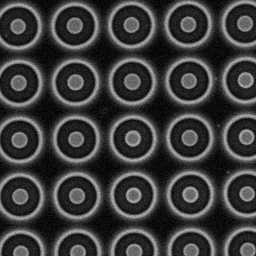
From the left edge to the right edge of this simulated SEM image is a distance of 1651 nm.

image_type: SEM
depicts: an array of small figures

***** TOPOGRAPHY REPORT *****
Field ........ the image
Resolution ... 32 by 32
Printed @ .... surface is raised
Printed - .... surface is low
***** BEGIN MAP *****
@@@@@@@@@@@@@@@@-@@@@@@-@@@@@@--
----@@@----@@@----@@@-----@@----
-----@@-----@@-----@@-----@@----
-----@@-----@@-----@@-----@@----
-----@@-----@@-----@@-----@@@---
@---@@@@---@@@@---@@@@@-@@@@@@-@
@@@@@@@@@@@@@@@@@@@@@@@@@@@@@@@@
@@@@@@@@@@@@@@@@@@@@@@@@@@@@@@-@
@---@@@@---@@@@----@@@----@@@---
-----@@-----@@-----@@-----@@----
-----@@-----@@-----@@-----@@----
-----@@-----@@-----@@-----@@@---
@---@@@@---@@@@---@@@@@--@@@@@-@
@@@@@@@@@@@@@@@@@@@@@@@@@@@@@@@@
@@@@@@@@@@@@@@@@@@@@@@@@@@@@@@@@
@---@@@@---@@@@---@@@@----@@@---
-----@@-----@@-----@@-----@@----
-----@@-----@@-----@@-----@@----
-----@@-----@@-----@@-----@@@---
@---@@@@---@@@@---@@@@---@@@@@--
@@@@@@@@@@@@@@@@@@@@@@@@@@@@@@@@
@@@@@@@@@@@@@@@@@@@@@@@@@@@@@@@@
@---@@@@---@@@@----@@@----@@@---
-----@@-----@@-----@@-----@@----
-----@@-----@@-----@@-----@@----
-----@@-----@@-----@@-----@@@---
@---@@@@---@@@@---@@@@---@@@@@--
@@@@@@@@@@@@@@@@@@@@@@@@@@@@@@@@
@@@@@@@@@@@@@@@@@@@@@@@@@@@@@@@@
@---@@@@---@@@@---@@@@----@@@---
-----@@-----@@-----@@-----@@@---
-----@@-----@@-----@@------@----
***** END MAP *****